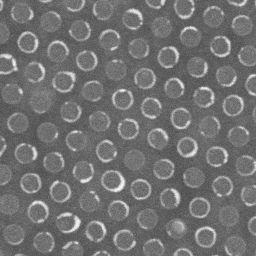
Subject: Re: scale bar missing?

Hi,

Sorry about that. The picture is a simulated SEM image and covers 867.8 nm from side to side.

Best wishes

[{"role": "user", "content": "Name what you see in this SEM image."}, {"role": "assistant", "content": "a regular array of raised bodies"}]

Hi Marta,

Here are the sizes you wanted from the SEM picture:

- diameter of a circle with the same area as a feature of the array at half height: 0.0673 um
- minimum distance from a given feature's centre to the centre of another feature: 101 nm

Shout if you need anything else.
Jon